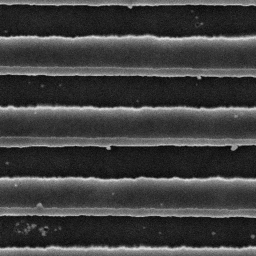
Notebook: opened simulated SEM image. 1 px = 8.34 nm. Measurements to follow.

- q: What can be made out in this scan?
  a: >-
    lines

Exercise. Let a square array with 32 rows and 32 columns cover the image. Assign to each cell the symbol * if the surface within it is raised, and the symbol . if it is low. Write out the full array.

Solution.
...*****************************
................................
................................
................................
................................
********************************
********************************
********************************
********************************
....................************
................................
................................
................................
.*...****..*....................
********************************
********************************
********************************
********************************
.............................*..
................................
................................
................................
********************************
********************************
********************************
********************************
********************************
................................
................................
................................
................................
********************************